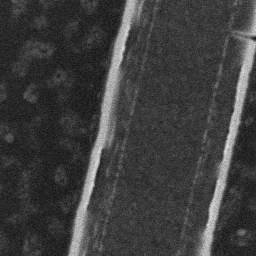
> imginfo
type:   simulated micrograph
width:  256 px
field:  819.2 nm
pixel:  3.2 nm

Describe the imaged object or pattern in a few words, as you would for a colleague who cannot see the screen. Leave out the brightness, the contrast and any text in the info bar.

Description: one or a few lines or trenches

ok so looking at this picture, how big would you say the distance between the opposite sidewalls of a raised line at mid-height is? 409 nm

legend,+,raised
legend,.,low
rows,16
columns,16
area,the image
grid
........++++++++
........++++++++
........++++++++
.......+++++++++
.......++++++++.
.......++++++++.
.......++++++++.
.......++++++++.
......++++++++..
......++++++++..
......++++++++..
......++++++++..
.....+++++++++..
.....++++++++...
.....++++++++...
.....++++++++...